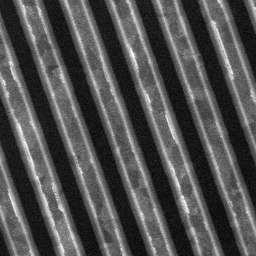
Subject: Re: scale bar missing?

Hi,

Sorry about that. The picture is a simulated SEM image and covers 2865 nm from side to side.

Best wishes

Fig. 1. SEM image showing parallel lines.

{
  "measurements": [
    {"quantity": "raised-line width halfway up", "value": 21.6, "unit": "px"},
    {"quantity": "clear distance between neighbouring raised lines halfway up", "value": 252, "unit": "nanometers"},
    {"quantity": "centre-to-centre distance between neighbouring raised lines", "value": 43.6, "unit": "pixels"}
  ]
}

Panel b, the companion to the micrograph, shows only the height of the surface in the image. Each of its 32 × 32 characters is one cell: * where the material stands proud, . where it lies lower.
..***...***...***..***...***...*
...**...***...***...***...**...*
...***...**...***...***...***...
...***...***...***...**...***...
*...**...***...***...***...**...
*...***...***...**...***...***..
*...***...***...***...**...***..
**...**...***...***...***...***.
**...***...***...**...***...***.
**...***...***...***...***...**.
***...***..***...***...***...***
***...***...***...**...***...***
.***..***...***...***...***...**
.***...***..***...***...***...**
.***...***...***...**...***...**
..***..***...***...***...***...*
..***...***...**...***...***...*
..***...***...***...**...***...*
...***..***...***...***...***...
...***...***...**...***...***...
...***...***...***...***...**...
*...***...**...***...***...***..
*...***...***...**...***...***..
**...**...***...***...***...**..
**...***...**...***...***...***.
**...***...***...***...**...***.
***...**...***...***...***...**.
***...***...***..***...***...***
***...***...***...***...**...***
.***...**...***...***...***...**
.***...***...***..***...***...**
.***...***...***...***...**...**